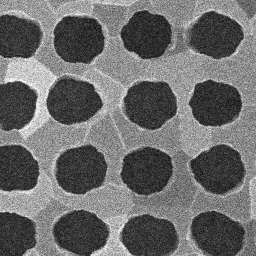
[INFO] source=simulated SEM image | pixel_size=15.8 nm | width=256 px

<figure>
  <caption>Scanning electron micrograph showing a regular array of holes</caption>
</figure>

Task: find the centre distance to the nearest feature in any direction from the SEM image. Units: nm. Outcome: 1040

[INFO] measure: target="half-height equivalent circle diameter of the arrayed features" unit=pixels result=50.7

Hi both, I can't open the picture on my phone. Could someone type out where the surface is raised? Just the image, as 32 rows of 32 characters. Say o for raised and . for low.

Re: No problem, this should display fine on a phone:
oooooooooooooooooooooooooooooooo
ooooooooooooooooo..ooooooo.ooooo
....oooo....oooo.....oooo....ooo
.....oo......oo......ooo......oo
.....oo......oo......oo.......oo
.....oo......oo......oo.......oo
....ooo......ooo.....oooo....ooo
oooooooo....oooooooooooooooooooo
oooooooooooooooooooooooooooooooo
oooooooo.ooooooooooooooooooooooo
...oooo....oooooo....oooo...oooo
.....o......oooo......oo......oo
.....o.......ooo......oo......oo
....oo.......oo.......oo......oo
....oo......oooo......oo......oo
...ooooo..ooooooo....oooo...oooo
oooooooooooooooooooooooooooooooo
oooooooooooooooooooooooooooooooo
...oooooo...oooooo.ooooooo...ooo
....ooo......ooo.....oooo.....oo
.....oo......oo......ooo......oo
.....oo......oo.......oo.......o
.....oo......oo......oooo.....oo
....oooo....oooo.....ooooo....oo
oooooooooooooooooooooooooooooooo
oooooooooooooooooooooooooooooooo
.oooooooo..ooooooooooooooo.ooooo
....ooo......ooo.....ooo.....ooo
....ooo.......o.......oo......oo
....ooo.......o.......oo.......o
....ooo......oo.......ooo.....oo
...oooooo...oooo......ooo.....oo